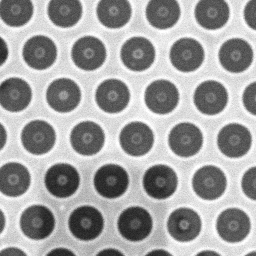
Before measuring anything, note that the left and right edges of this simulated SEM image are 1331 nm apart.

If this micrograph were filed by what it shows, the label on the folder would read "an array of small figures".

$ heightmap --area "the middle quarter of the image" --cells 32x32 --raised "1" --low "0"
11100000001111100000001111100000
11110000111111110000011111110000
11111111111111111111111111111111
01111111111000111111111101111111
00011111100000011111110000011111
00001111000000001111100000001111
00001111000000000111000000000111
00000111000010000111000010000111
00000111000010000111000110000111
00001111000000001111000000000111
00001111000000001111000000001111
00011111100000011111100000001111
11111111111001111111110000111111
11111111111111111111111111111111
11110000111111110000111111111000
11000000011111100000011111100000
11000000001111000000001111000000
10000000001111000000000111000000
10000110000110000110000111000010
10000100001111000110000111000010
11000000001111000000000111000000
11000000001111000000001111000000
11100000011111100000011111100000
11111111111111111111111111111001
01111111111111111111111111111111
00011111100000011111110000011111
00001111000000001111000000001111
00001110000000001111000000001111
00001110000100001110000000000111
00001110000110000110000110000111
00001110000000001111000010000111
00011111000000001111000000001111